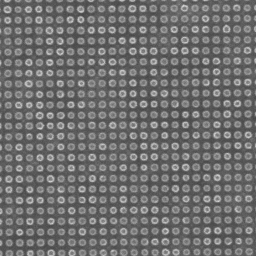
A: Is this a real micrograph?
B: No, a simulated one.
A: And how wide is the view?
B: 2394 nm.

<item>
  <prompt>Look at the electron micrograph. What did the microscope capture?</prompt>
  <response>a regular array of raised bodies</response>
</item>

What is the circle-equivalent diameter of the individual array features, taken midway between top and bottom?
0.0633 µm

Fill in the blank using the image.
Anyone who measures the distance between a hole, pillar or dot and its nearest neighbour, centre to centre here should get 96.3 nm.